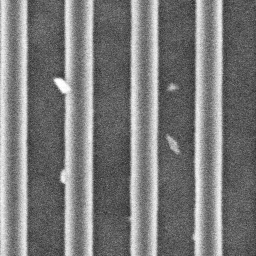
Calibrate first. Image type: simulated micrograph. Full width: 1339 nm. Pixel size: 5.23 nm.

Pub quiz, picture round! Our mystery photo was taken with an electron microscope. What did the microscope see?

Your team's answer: lines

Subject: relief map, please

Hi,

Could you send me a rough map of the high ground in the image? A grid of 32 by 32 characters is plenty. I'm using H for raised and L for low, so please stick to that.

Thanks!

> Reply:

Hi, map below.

HHHLLLLLHHHLLLLLLHHLLLLLLHHHLLLL
HHHLLLLLHHHLLLLLLHHLLLLLLHHHLLLL
HHHLLLLLHHHLLLLLLHHLLLLLLHHHLLLL
HHHLLLLLHHHLLLLLLHHLLLLLLHHHLLLL
HHHLLLLLHHHLLLLLLHHLLLLLLHHHLLLL
HHHLLLLLHHHLLLLLLHHLLLLLLHHHLLLL
HHHLLLLLHHHLLLLLLHHLLLLLLHHHLLLL
HHHLLLLLHHHLLLLLLHHLLLLLLHHHLLLL
HHHLLLLLHHHLLLLLLHHLLLLLLHHHLLLL
HHHLLLLLHHHLLLLLLHHLLLLLLHHHLLLL
HHHLLLLHHHHLLLLLLHHLLLLLLHHHLLLL
HHHLLLLLHHHLLLLLLHHLLLLLLHHLLLLL
HHHLLLLLHHHLLLLLLHHLLLLLLHHLLLLL
HHHLLLLLHHHLLLLLLHHLLLLLLHHLLLLL
HHHLLLLLHHHLLLLLLHHLLLLLLHHHLLLL
HHHLLLLLHHHLLLLLLHHLLLLLLHHHLLLL
HHHLLLLLHHHLLLLLLHHLLLLLLHHHLLLL
HHHLLLLLHHHLLLLLLHHLLLLLLHHHLLLL
HHHLLLLLHHHLLLLLLHHLLLLLLHHHLLLL
HHHLLLLLHHHLLLLLLHHLLLLLLHHHLLLL
HHHLLLLLHHHLLLLLLHHLLLLLLHHHLLLL
HHHLLLLLHHHLLLLLLHHLLLLLLHHLLLLL
HHHLLLLLHHHLLLLLHHHLLLLLLHHLLLLL
HHHLLLLLHHHLLLLLHHHLLLLLLHHLLLLL
HHHLLLLLHHHLLLLLHHHLLLLLLHHLLLLL
HHHLLLLLHHHLLLLLHHHLLLLLLHHLLLLL
HHHLLLLLHHHLLLLLLHHLLLLLLHHHLLLL
HHHLLLLLHHHLLLLLLHHLLLLLLHHHLLLL
HHHLLLLLHHHLLLLLLHHLLLLLLHHHLLLL
HHHLLLLLHHHLLLLLLHHLLLLLLHHHLLLL
HHHLLLLLHHHLLLLLLHHLLLLLLHHHLLLL
HHHLLLLLHHHLLLLLLHHLLLLLLHHHLLLL